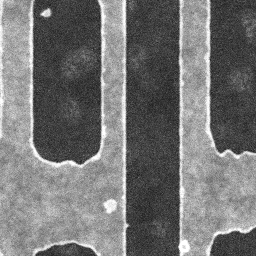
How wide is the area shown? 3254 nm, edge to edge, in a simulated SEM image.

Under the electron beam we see one or a few lines or trenches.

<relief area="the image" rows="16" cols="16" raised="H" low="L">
HHLLLLHHLLLHHLLL
HHLLLLHHLLLHHLLL
HHLLLLHHLLLHHLLL
HHLLLLHHLLLHHLLL
HHLLLLHHLLLHHLLL
HHLLLLHHLLLHHLLL
HHLLLLHHLLLHHLLL
HHLLLLHHLLLHHLLL
HHLLLLHHLLLHHLLL
HHLLLLHHLLLHHHLL
HHHHHHHHLLLHHHHH
HHHHHHHHLLLHHHHH
HHHHHHHHLLLHHHHH
HHHHHHHHLLLHHHHH
HHHHHHHHLLLHHHLL
HHHLLLHHLLLHHLLL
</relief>